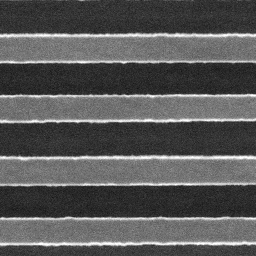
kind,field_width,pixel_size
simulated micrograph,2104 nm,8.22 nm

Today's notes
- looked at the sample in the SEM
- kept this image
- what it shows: lines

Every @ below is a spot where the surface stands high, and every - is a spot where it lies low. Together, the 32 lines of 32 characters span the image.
--------------------------------
--------------------------------
--------------------------------
--------------------------------
--@@@@@@@-@--@@@@@-@@@@@@@@@@@@@
@@@@@@@@@@@@@@@@@@@@@@@@@@@@@@@@
@@@@@@@@@@@@@@@@@@@@@@@@@@@@@@@@
@@@@@@@@@@@@@@@@@@@@@@@@@@@@@@@@
--------------------------------
--------------------------------
--------------------------------
--------------------------------
@@@@@@@@@@@@@@@@@@@@@@@@@@@@@@@@
@@@@@@@@@@@@@@@@@@@@@@@@@@@@@@@@
@@@@@@@@@@@@@@@@@@@@@@@@@@@@@@@@
--------------------------------
--------------------------------
--------------------------------
--------------------------------
--------------------------------
@@@@@@@@@@@@@@@@@@@@@@@@@@@@@@@@
@@@@@@@@@@@@@@@@@@@@@@@@@@@@@@@@
@@@@@@@@@@@@@@@@@@@@@@@@@@@@@@@@
--------------------------------
--------------------------------
--------------------------------
--------------------------------
@@@@@@@@@@@@@@@@@@@@@@@@@@@@@@@@
@@@@@@@@@@@@@@@@@@@@@@@@@@@@@@@@
@@@@@@@@@@@@@@@@@@@@@@@@@@@@@@@@
@@@--@@@------------------------
--------------------------------